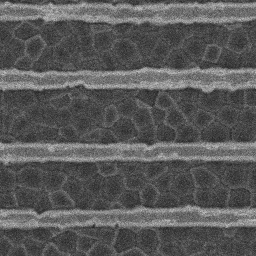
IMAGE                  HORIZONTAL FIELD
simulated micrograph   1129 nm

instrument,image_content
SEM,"one or a few lines or trenches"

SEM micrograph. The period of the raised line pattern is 302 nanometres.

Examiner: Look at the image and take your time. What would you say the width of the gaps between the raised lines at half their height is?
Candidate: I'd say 238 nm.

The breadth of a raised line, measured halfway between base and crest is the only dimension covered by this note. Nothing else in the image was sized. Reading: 61.2 nm